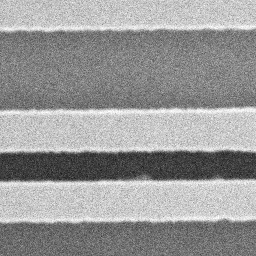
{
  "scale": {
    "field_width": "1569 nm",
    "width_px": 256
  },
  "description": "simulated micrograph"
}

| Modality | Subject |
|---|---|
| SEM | lines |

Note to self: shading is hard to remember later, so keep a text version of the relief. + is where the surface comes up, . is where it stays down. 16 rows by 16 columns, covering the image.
++++++++++++++++
++++++++++++++++
................
................
................
................
................
++++++++++++++++
++++++++++++++++
................
................
++++++++++++++++
++++++++++++++++
++++++++++++++++
................
................